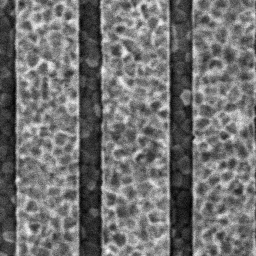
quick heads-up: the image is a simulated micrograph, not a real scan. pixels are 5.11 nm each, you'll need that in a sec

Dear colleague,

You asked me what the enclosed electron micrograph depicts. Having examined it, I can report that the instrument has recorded one or a few lines or trenches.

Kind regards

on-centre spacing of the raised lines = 452 nanometers